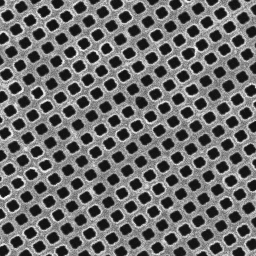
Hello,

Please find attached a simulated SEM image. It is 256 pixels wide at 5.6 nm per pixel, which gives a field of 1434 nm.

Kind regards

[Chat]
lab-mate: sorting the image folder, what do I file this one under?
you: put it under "a regular array of holes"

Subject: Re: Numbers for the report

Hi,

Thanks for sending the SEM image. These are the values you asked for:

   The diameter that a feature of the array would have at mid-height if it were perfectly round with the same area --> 61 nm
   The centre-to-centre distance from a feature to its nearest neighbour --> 0.0906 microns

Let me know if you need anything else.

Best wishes